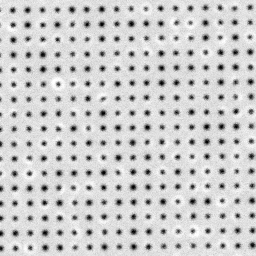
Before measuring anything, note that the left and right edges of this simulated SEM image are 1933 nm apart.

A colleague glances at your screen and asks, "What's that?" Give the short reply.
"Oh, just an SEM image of a regular array of holes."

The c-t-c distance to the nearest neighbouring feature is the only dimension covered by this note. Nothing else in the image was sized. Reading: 0.11 um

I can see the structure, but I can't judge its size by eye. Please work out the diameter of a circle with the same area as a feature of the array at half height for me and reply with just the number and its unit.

40.9 nm